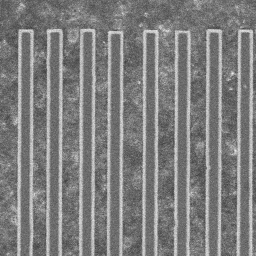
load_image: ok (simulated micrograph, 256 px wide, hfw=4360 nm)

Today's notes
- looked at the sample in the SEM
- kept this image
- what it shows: parallel lines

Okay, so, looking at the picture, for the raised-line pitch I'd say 0.534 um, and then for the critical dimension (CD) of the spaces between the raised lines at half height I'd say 319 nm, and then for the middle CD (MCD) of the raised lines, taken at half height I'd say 209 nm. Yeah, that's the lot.